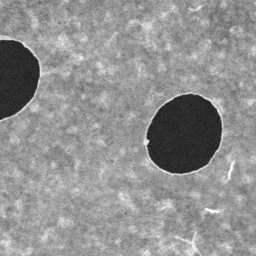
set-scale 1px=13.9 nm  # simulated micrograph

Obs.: holes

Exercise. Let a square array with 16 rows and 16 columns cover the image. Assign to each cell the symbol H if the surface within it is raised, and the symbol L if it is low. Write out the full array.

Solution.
HHHHHHHHHHHHHHHH
HHHHHHHHHHHHHHHH
LHHHHHHHHHHHHHHH
LLHHHHHHHHHHHHHH
LLLHHHHHHHHHHHHH
LLHHHHHHHHHHHHHH
LLHHHHHHHHLLLHHH
HHHHHHHHHLLLLLHH
HHHHHHHHHLLLLLHH
HHHHHHHHHLLLLLHH
HHHHHHHHHHLLLHHH
HHHHHHHHHHHHHHHH
HHHHHHHHHHHHHHHH
HHHHHHHHHHHHHHHH
HHHHHHHHHHHHHHHH
HHHHHHHHHHHHHHHH